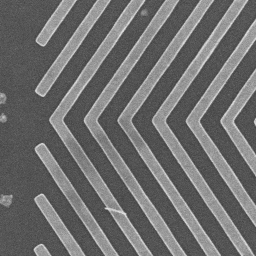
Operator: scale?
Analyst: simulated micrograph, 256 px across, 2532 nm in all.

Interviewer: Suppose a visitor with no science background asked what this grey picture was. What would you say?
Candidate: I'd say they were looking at groups of lines, slits or small figures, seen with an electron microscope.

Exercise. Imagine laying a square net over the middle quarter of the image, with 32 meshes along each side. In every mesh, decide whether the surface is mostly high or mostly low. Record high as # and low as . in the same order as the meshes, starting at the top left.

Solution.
......###.....###......###.....#
.....###......###.....###......#
....####.....###.....####.....##
....###.....###......###.....###
...###.....####.....###......###
..###......###.....####.....###.
..##......###......###.....###..
.###.....####.....###......###..
###......###.....####.....###...
##......###......###.....###....
##.....###......###.....####....
#......###.....###......###.....
......###.....####.....###......
.....###......###.....####.....#
.....###......###.....###......#
#.....###.....###......###.....#
#.....####.....###.....####.....
##.....###......###.....###.....
##......###.....###......###....
###.....####.....###.....####...
####.....###......###.....###...
.####.....###.....###......###..
..###.....####.....###.....####.
..####.....###......###.....###.
...####.....###.....###......###
....###.....####.....###.....###
....####.....###......###.....##
.....####.....###.....###......#
#.....###.....####.....###.....#
#.....####.....###......###.....
##.....####.....###.....###.....
###.....###.....###......###....